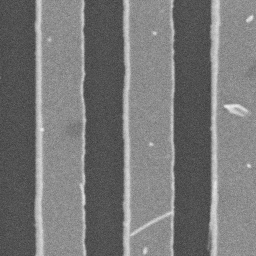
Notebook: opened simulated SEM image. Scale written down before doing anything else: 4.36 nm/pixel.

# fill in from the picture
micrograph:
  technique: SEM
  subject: lines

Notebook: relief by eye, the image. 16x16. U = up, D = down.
DDUUUDDDUUUDDUUU
DDUUUDDDUUUDDUUU
DDUUUDDDUUUDDUUU
DDUUUDDDUUUDDUUU
DDUUUDDDUUUDDUUU
DDUUUDDDUUUDDUUU
DDUUUDDDUUUDDUUU
DDUUUDDDUUUDDUUU
DDUUUDDDUUUDDUUU
DDUUUDDDUUUDDUUU
DDUUUDDDUUUDDUUU
DDUUUDDDUUUDDUUU
DDUUUDDDUUUDDUUU
DDUUUDDDUUUDDUUU
DDUUUDDDUUUDDUUU
DDUUUDDDUUUDDUUU